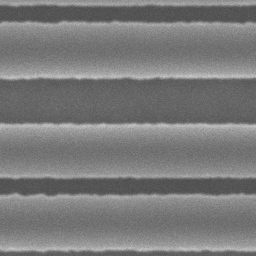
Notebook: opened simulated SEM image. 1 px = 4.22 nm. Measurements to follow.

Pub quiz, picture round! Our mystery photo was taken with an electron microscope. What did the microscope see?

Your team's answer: lines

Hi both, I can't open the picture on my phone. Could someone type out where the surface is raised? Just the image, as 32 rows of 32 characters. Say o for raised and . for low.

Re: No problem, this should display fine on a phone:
oooooooooooooooooooooooooooooooo
................................
................................
oooooooooooooooooooooooooooooooo
oooooooooooooooooooooooooooooooo
oooooooooooooooooooooooooooooooo
oooooooooooooooooooooooooooooooo
oooooooooooooooooooooooooooooooo
oooooooooooooooooooooooooooooooo
oooooooooooooooooooooooooooooooo
................................
................................
................................
................................
................................
................................
oooooooooooooooooooooooooooooooo
oooooooooooooooooooooooooooooooo
oooooooooooooooooooooooooooooooo
oooooooooooooooooooooooooooooooo
oooooooooooooooooooooooooooooooo
oooooooooooooooooooooooooooooooo
................................
................................
ooo.oo.ooooooooooooooooooooooooo
oooooooooooooooooooooooooooooooo
oooooooooooooooooooooooooooooooo
oooooooooooooooooooooooooooooooo
oooooooooooooooooooooooooooooooo
oooooooooooooooooooooooooooooooo
oooooooooooooooooooooooooooooooo
................................